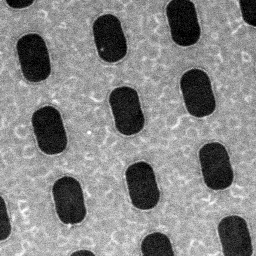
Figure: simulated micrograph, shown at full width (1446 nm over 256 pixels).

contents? a regular array of raised bodies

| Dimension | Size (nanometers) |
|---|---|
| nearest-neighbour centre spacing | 416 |